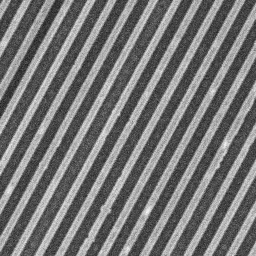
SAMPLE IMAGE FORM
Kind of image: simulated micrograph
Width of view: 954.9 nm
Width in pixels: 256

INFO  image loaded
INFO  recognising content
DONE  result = parallel lines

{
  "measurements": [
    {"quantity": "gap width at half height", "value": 45.6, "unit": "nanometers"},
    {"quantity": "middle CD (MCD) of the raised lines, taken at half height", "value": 25.8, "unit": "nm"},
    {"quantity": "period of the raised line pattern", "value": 18.7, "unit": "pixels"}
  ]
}